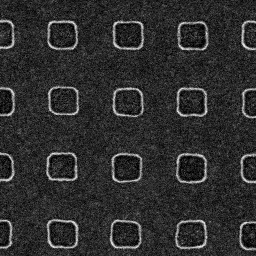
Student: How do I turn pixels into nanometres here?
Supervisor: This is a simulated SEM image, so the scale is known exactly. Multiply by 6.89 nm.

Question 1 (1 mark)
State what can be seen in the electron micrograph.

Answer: a regular array of raised bodies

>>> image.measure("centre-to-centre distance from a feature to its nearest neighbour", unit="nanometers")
442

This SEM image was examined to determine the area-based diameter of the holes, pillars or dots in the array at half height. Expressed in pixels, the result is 30.6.